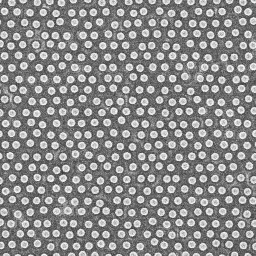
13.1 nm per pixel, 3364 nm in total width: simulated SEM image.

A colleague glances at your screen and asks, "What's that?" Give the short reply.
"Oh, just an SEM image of a regular array of raised bodies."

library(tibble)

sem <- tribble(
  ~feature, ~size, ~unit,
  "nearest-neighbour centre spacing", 0.145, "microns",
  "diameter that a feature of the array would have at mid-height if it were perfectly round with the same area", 0.0926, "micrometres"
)